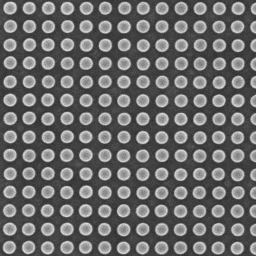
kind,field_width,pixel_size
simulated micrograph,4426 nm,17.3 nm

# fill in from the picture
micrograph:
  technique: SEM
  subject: a regular array of raised bodies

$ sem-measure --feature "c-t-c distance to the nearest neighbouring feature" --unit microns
0.314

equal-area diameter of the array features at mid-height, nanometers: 218